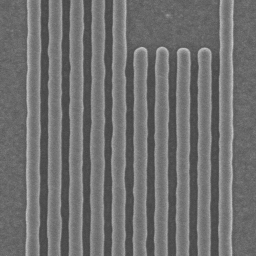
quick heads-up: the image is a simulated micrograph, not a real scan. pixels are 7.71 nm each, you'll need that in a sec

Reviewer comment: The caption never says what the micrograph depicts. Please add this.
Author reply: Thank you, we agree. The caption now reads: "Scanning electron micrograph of groups of lines, slits or small figures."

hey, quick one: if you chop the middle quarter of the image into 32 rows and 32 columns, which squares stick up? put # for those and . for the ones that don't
..###..###..###..####..###..###.
..###..###..###...###..###..###.
..###..###..###...###..###..###.
..###..###..###...###..###..###.
..###..###..###...##...###..###.
..###..###..###...###..###..###.
..###..###..###...###..###..###.
..###..###..###...##...###..###.
..###..###..###...###..###..###.
..###..###..###...###..###..###.
..###..###..####..###..###..###.
..###..###..####.####..###..###.
..###..###..###...###..###..###.
..###..###..###...###..###..###.
..###..###..###...###..###..###.
..###..###..###...###..###..###.
..###..###..###...###..###..###.
..###..###..###...###..###..###.
..###..###..###..####..###..###.
..###..###..###..####..###..###.
..###..###..###...###..###..###.
..###..###..###...###..###..###.
..###..###..###...###..###..###.
.####..###..###...###..###..###.
.####..###..###...###..###..###.
..###..###..###..####..###..###.
..##...###..###...##...###..###.
..###..###..###...###..###..###.
..###..###..###...###..###..###.
..###..###..###...##...###..###.
..###..###..###..####..###..###.
..###..###..###..####..###..###.